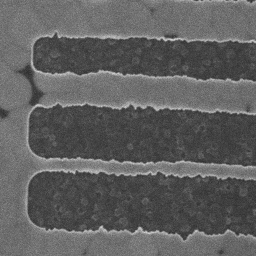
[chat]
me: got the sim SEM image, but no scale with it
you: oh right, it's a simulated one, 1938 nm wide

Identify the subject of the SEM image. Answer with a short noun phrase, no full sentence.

one or a few lines or trenches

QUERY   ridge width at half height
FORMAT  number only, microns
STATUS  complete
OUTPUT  0.243